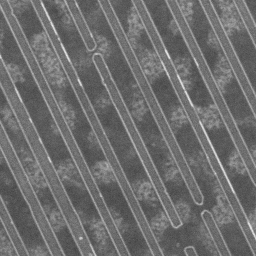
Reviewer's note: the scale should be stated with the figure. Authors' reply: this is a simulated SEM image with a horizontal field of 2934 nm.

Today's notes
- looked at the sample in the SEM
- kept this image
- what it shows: parallel lines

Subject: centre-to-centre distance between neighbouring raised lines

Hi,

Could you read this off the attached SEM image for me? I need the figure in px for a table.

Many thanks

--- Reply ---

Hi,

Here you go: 30.4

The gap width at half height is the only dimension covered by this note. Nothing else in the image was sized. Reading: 98.2 nm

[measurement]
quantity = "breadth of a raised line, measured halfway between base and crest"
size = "246 nanometers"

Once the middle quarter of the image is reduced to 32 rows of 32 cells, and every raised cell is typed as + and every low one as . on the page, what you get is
..++++++...+++++...++++++..+++++
...++++++..++++++...+++++...++++
+..++++++...+++++...++++++..++++
+...++++++..++++++...+++++...+++
++..++++++...+++++...++++++..+++
++..+++++++..++++++...+++++...++
++...++++++..++++++...++++++..++
+++..++++++...++++++..++++++...+
+++...++++++..++++++...++++++..+
++++..++++++...++++++..++++++...
++++...++++++..++++++...++++++..
+++++..++++++...++++++..++++++..
+++++...++++++..++++++...++++++.
++++++..++++++...++++++..++++++.
.+++++...++++++..++++++...++++++
.++++++..++++++...++++++..++++++
.++++++...++++++..++++++...+++++
..++++++..++++++...++++++..+++++
..++++++...++++++..++++++...++++
...++++++..++++++...++++++..++++
+..++++++...++++++..++++++...+++
+...++++++..++++++...+++++...+++
++..++++++...++++++..++++++...++
++...++++++..++++++...+++++...++
+++..++++++...++++++..++++++...+
+++...++++++..++++++...+++++...+
++++..++++++...++++++..++++++..+
++++...++++++..++++++...+++++...
+++++..++++++..+++++++..++++++..
+++++...++++++..++++++..++++++..
++++++..++++++..+++++++..++++++.
++++++...+++++...++++++..++++++.